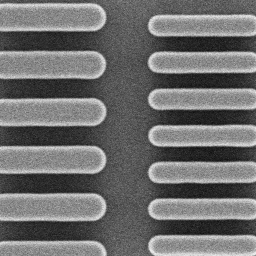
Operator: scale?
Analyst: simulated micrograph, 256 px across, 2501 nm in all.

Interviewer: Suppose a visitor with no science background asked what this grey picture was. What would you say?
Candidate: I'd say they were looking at groups of lines, slits or small figures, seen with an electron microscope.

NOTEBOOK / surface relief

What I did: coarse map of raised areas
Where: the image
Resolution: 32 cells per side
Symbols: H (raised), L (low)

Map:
LLLLLLLLLLLLLLLLLLLLLLLLLLLLLLLL
HHHHHHHHHHHHHLLLLLLLLLLLLLLLLLLL
HHHHHHHHHHHHHLLLLLLHHHHHHHHHHHHH
HHHHHHHHHHHHHLLLLLLHHHHHHHHHHHHH
LLLLLLLLLLLLLLLLLLLLLLLLLLLHLLLL
LLLLLLLLLLLLLLLLLLLLLLLLLLLLLLLL
LLLLHHHLLLLLLLLLLLLLLLLLLLLLLLLL
HHHHHHHHHHHHHLLLLLLHHHHHHHHHHHHH
HHHHHHHHHHHHHLLLLLLHHHHHHHHHHHHH
HHHHHHHHHHHHLLLLLLLLLLLLLLLLLLLL
LLLLLLLLLLLLLLLLLLLLLLLLLLLLLLLL
LLLLLLLLLLLLLLLLLLLHHHHHHHHHHHHH
HHHHHHHHHHHHLLLLLLLHHHHHHHHHHHHH
HHHHHHHHHHHHHLLLLLLHHHHHHHHHHHHH
HHHHHHHHHHHHHLLLLLLLLLLLLLLLLLLL
HHHHHHHHHHHHLLLLLLLLLLLLLLLLLLLL
LLLLLLLLLLLLLLLLLLLHHHHHHHHHHHHH
LLLLLLLLLLLLLLLLLLLHHHHHHHHHHHHH
HHHHHHHHHHHHLLLLLLLLLLLLLLLLLLLL
HHHHHHHHHHHHHLLLLLLLLLLLLLLLLLLL
HHHHHHHHHHHHHLLLLLLHHHHHHHHHHHHH
HHHHHHHHHHHHLLLLLLLHHHHHHHHHHHHH
LLLLLLLLLLLLLLLLLLLHHHHHHHHHHHHH
LLLLLLLLLLLLLLLLLLLLLLLLLLLLLLLL
HHHHHHHHHHHHLLLLLLLLLLLLLLLLLLLL
HHHHHHHHHHHHHLLLLLLHHHHHHHHHHHHH
HHHHHHHHHHHHHLLLLLLHHHHHHHHHHHHH
LLHLLLLHHHLLLLLLLLLLLLLLLLLLLLLL
LLLLLLLLLLLLLLLLLLLLLLLLLLLLLLLL
LLLLLLLLLLLLLLLLLLLLHHHHHHHHHHHH
HHHHHHHHHHHHHLLLLLLHHHHHHHHHHHHH
HHHHHHHHHHHHHLLLLLLHHHHHHHHHHHHH